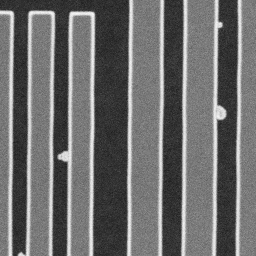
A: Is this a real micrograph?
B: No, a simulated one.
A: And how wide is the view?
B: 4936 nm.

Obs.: groups of lines, slits or small figures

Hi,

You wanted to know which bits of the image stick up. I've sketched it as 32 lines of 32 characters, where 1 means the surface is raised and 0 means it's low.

00000000000000001111000111100011
00000000000000001111000111100011
11001110011100001111000111100011
11001110011100001111000111100011
11001110011100001111000111100011
11001110011100001111000111100011
10001110011100001111000111100011
10001100011100001111000111100011
10001100011100001111000111100011
10001100011100001111000111100011
10001100011000001111000111100011
10001100011000001111000111100011
10001100011000001111000111100011
10001100011100001111000111100011
10001100011100001111000111110011
10001100011100001111000111100011
10001100011100001111000111100011
10001100011000001111000111100011
10001100011000001111000111100011
10001100111000001111000111100011
10001100011000001111000111100011
10001100011000001111000111100011
10001100011000001111000111100011
10001100011000001111000111100011
10001100011000001111000111100011
10001100011000001111000111100011
10001100011000001111000111100011
10001100011000001111000111100011
10011100011000001111000111100011
10011100011000001111000111100011
10011100011000001111000111100011
10011100011000001111000111100011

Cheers